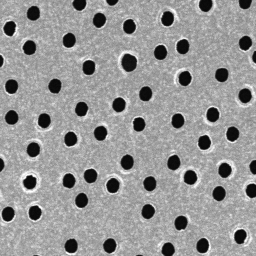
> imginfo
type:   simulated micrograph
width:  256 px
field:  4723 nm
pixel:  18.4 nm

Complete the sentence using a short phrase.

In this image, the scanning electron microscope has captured a regular array of holes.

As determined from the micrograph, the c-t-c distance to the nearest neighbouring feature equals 30.3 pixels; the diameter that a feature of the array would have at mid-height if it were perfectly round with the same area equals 266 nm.